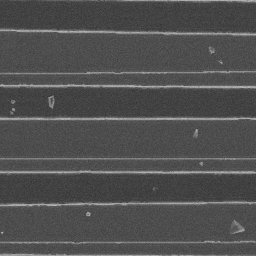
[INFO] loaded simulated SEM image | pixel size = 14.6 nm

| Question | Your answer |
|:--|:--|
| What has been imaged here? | lines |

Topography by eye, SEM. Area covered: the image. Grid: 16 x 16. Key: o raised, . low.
................
................
oooooooooooooooo
oooooooooooooooo
oooooooooooooooo
................
................
oooooooooooooooo
oooooooooooooooo
oooooooooooooooo
oooooooooooooooo
................
................
oooooooooooooooo
oooooooooooooooo
oooooooooooooooo